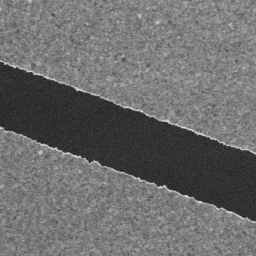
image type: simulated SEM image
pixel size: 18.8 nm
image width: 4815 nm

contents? one or a few lines or trenches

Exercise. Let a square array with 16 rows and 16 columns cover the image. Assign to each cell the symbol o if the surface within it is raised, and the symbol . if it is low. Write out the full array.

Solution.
oooooooooooooooo
oooooooooooooooo
oooooooooooooooo
oooooooooooooooo
..oooooooooooooo
.....ooooooooooo
.......ooooooooo
..........oooooo
o............ooo
oooo............
ooooooo.........
oooooooooo......
oooooooooooo....
ooooooooooooooo.
oooooooooooooooo
oooooooooooooooo